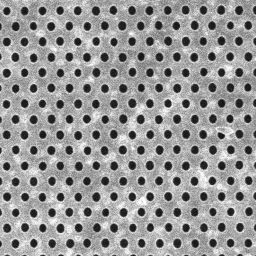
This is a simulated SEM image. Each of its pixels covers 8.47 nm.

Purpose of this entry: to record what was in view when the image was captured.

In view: a regular array of holes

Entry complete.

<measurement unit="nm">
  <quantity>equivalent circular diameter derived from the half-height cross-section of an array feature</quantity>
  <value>70.2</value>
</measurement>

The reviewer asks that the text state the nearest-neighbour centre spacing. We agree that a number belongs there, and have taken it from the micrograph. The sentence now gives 17.4 pixels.